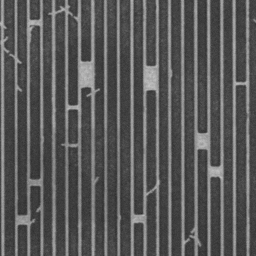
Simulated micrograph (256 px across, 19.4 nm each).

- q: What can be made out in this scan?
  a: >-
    parallel lines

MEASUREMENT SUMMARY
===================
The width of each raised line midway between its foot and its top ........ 50.9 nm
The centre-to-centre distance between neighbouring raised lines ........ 0.25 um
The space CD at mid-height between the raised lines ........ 0.203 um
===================